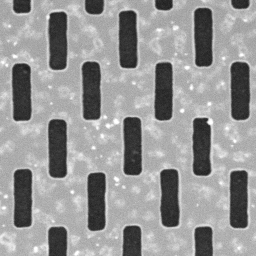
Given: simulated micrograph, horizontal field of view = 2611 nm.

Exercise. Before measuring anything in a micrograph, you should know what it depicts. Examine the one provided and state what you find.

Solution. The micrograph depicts a regular array of holes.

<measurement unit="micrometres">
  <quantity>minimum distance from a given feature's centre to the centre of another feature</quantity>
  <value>0.638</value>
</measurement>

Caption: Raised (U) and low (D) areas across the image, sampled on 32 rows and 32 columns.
UUDDUUUUUUUDDUUUUUUDDDUUUUUUUDDU
UUDUUUUDUUUDDUUDDUUUUUUUDDUUUUUU
UUUUUUDDDUUUUUUDDUUUUUUUDDDUUUUU
UUUUUUDDUUUUUUUDDUUUUUUUDDDUUUUU
UUUUUUDDUUUUUUUDDUUUUUUUDDDUUUUU
UUUUUUDDUUUUUUUDDUUUUUUUDDDUUUUU
UUUUUUDDUUUUUUUDDUUUUUUUDDDUUUUU
UUUUUUDDUUUUUUUDDUUUUUUUDDDUUUUU
UUDDUUDDUUDDDUUUDUUDDDUUUUUUUDDU
UDDDUUUUUUDDDUUUUUUDDDUUUUUUUDDU
UDDDUUUUUUDDDUUUUUUDDDUUUUUUUDDU
UDDDUUUUUUDDDUUUUUUDDDUUUUUUUDDU
UUDDUUUUUUDDDUUUUUUDDDUUUUUUUDDU
UUDDUUUUUUDDDUUUUUUDDDUUUUUUUDDU
UUDDUUUUUUDDUUUUUUUDDUUUUUUUUDDU
UUUUUUDDUUUUUUUDDDUUUUUUDDUUUUUU
UUUUUUDDUUUUUUUDDDUUUUUUDDUUUUUU
UUUUUUDDUUUUUUUDDDUUUUUUDDUUUUUU
UUUUUUDDUUUUUUUDDDUUUUUUDDUUUUUU
UUUUUUDDUUUUUUUDDDUUUUUUDDUUUUUU
UUUUUUDDUUUUUUUDDDUUUUUUDDUUUUUU
UUDDUUDDUUUUUUUUDDUUDDUUDDUUUDDU
UUDDUUUUUUUDDUUUUUUUDDUUUUUUUDDU
UUDDUUUUUUUDDUUUUUUUDDUUUUUUUDDU
UUDDUUUUUUUDDUUUUUUUDDUUUUUUUDDU
UUDDUUUUUUUDDUUUUUUUDDUUUUUUUDDU
UUDDUUUUUUUDDUUUUUUUDDDUUUUUUDDU
UUDDUUUUUUUDDUUUUUUUDDUUUUUUUDDU
UUUUUUDDUUUDDUUUDUUUUUUUUDUUUDDU
UUUUUUDDUUUUUUUDDDUUUUUUDDDUUUUU
UUUUUUDDUUUUUUUDDDUUUUUUDDDUUUUU
UUUUUUDDUUUUUUUDDDUUUUUUDDDUUUUU